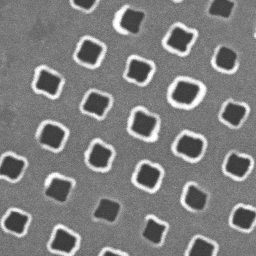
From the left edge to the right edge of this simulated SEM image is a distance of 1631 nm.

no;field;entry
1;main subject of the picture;a regular array of holes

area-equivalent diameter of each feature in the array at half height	22.6	px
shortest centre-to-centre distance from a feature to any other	327	nanometers